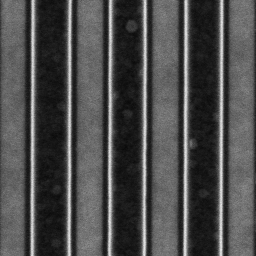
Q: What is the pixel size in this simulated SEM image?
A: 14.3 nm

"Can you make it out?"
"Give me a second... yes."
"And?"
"one or a few lines or trenches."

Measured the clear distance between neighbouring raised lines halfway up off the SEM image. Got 0.561 micrometres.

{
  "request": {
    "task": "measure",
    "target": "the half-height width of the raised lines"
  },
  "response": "536 nanometres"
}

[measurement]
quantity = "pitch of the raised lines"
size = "76.2 pixels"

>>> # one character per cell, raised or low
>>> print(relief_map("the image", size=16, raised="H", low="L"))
LLHHLLLHHLLLHHLL
LLHHLLLHHLLLHHLL
LLHHLLLHHLLLHHLL
LLHHLLLHHLLLHHLL
LLHHLLLHHLLLHHLL
LLHHLLLHHLLLHHLL
LLHHLLLHHLLLHHLL
LLHHLLLHHLLLHHLL
LLHHLLLHHLLLHHLL
LLHHLLLHHLLLHHLL
LLHHLLLHHLLLHHLL
LLHHLLLHHLLLHHLL
LLHHLLLHHLLLHHLL
LLHHLLLHHLLLHHLL
LLHHLLLHHLLLHHLL
LLHHLLLHHLLLHHLL